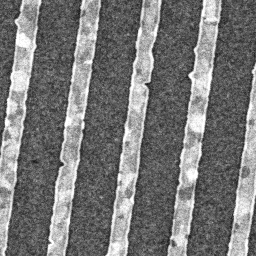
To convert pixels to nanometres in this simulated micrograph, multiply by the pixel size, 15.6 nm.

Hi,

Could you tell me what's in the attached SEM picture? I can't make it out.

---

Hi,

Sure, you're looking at parallel lines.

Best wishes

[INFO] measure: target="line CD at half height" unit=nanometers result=260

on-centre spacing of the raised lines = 932 nm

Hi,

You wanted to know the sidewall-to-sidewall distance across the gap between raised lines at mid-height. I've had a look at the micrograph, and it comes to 675 nanometers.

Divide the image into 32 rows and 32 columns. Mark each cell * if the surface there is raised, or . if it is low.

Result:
...**.....**......**......**....
...**.....**......**.....**.....
..***.....**......**.....**.....
..***.....**......**.....**.....
..**......**.....**......**.....
..**......**.....**......**.....
..**.....***.....**......**.....
..**.....**......**......**.....
..**.....**......**.....***.....
.***.....**......**.....**......
..**.....**......*......**......
.**......**.....**......**.....*
.**......**.....**......**.....*
.**......**.....**......**.....*
.**.....**......**......**.....*
.**.....**......**.....**......*
.**.....**......**.....**......*
***.....**......**.....**......*
**......**.....**......**......*
**......**.....**......**.....**
**......**.....**......**.....**
**......*......**......**.....**
**.....**......**......*......**
**.....**......**.....**......**
**.....**......**.....**......**
*......**.....***.....**......**
*......**.....**......**.....***
*......**.....**......**.....**.
*.....**......**......**.....**.
*.....**......**......**.....**.
*.....**......**.....**......**.
*.....**......**.....**......**.